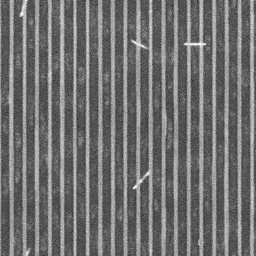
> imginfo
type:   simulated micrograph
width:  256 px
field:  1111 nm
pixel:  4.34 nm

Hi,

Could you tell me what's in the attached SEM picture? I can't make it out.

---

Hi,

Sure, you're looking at parallel lines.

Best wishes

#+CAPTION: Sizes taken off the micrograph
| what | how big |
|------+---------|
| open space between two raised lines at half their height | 41.7 nm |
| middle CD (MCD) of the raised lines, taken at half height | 15.2 nanometres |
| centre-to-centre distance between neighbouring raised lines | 0.0549 um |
